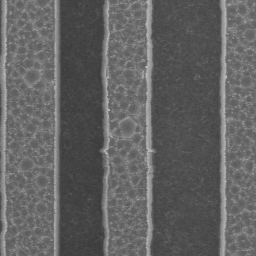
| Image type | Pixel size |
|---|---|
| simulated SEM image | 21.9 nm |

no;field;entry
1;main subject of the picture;one or a few lines or trenches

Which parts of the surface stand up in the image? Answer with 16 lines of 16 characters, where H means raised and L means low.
HHHHLLLHHLLLLLHH
HHHHLLLHHLLLLLHH
HHHHLLLHHLLLLLHH
HHHHLLLHHLLLLLHH
HHHHLLHHHLLLLLHH
HHHHLLLHHLLLLLHH
HHHHLLLHHLLLLLHH
HHHHLLLHHLLLLLHH
HHHHLLLHHLLLLLHH
HHHHLLLHHLLLLLHH
HHHHLLLHHLLLLLHH
HHHHLLLHHLLLLLHH
HHHHLLLHHLLLLLHH
HHHHLLLHHLLLLLHH
HHHHLLLHHLLLLLHH
HHHHLLLHHLLLLLHH